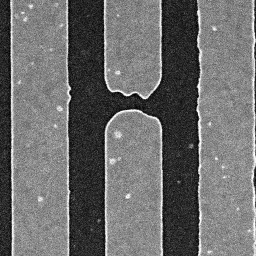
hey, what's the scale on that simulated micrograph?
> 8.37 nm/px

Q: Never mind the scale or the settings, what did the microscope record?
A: one or a few lines or trenches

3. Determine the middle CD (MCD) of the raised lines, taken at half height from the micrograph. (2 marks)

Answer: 0.472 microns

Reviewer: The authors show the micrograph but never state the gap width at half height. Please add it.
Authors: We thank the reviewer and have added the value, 310 nanometres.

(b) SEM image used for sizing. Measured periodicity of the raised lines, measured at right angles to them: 781 nanometers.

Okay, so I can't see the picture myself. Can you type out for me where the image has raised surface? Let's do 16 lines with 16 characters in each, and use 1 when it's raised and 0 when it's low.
0111000111001111
0111000111001111
0111000111001111
0111000111000111
0111000111000111
0111000111001111
0111000000001111
0111000111001111
0111000111000111
0111000111000111
0111000111001111
0111000111001111
0111000111001111
0111000111000111
0111000111001111
0111000111001111